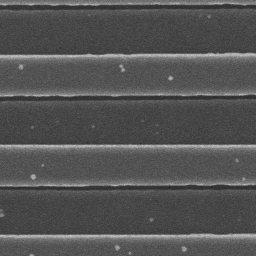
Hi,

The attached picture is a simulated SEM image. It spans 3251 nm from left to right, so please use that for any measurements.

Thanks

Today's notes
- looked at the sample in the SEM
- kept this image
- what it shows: lines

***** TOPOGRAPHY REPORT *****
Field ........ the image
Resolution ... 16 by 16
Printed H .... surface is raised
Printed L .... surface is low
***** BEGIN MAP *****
LLLLLLLLLLLLLLLL
LLLLLLLLLLLLLLLL
LLLLLLLLLLLLLLLL
HHHHHHHHHHHHHHHH
HHHHHHHHHHHHHHHH
HHHHHHHHHHHHHHHH
LLLLLLLLLLLLLLLL
LLLLLLLLLLLLLLLL
LLLLLLLLLLLLLLLL
HHHHHHHHHHHHHHHH
HHHHHHHHHHHHHHHH
HHHHHHHHHHHHHHHH
LLLLLLLLLLLLLLLL
LLLLLLLLLLLLLLLL
LLLLLLLLLLLLLLLL
HHHHHHHHHHHHHHHH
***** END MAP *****